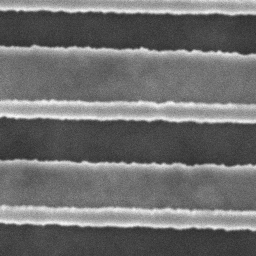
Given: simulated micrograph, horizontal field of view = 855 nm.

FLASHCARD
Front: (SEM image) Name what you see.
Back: lines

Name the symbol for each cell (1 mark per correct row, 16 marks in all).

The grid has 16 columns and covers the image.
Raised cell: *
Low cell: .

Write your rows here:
****************
................
................
****************
****************
****************
****************
..........******
................
................
****************
****************
****************
****************
................
................